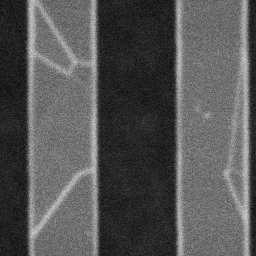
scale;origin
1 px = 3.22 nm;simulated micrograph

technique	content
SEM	wiring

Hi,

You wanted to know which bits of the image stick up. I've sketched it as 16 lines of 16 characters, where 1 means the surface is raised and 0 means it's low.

0011110000011110
0011110000011110
0011110000011110
0011110000011110
0011110000011110
0011110000011110
0011110000011110
0011110000011110
0011110000011110
0011110000011110
0011110000011110
0011110000011110
0011110000011110
0011110000011110
0011110000011110
0011110000011110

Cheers